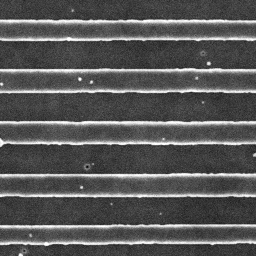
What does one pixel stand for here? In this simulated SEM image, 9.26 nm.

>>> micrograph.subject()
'lines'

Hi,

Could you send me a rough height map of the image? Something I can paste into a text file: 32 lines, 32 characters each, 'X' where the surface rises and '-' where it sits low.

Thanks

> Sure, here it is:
--------------------------------
--------------------------------
--------------------------------
XXXXXXXXXXXXXXXXXXXXXXXXXXXXXXXX
XXXXXXXXXXXXXXXXXXXXXXXXXXXXXXXX
--------------------------------
--------------------------------
--------------------------------
--------------------------------
XXXXXXXXXXXXXXXXXXXXXXXXXXXXXXXX
XXXXXXXXXXXXXXXXXXXXXXXXXXXXXXXX
XXXXXXXXXX-X--XX-XXXX-X-----XXXX
--------------------------------
--------------------------------
--------------------------------
XXXXXXXXXXXXXXXXXXXXXXXXXXXXXXXX
XXXXXXXXXXXXXXXXXXXXXXXXXXXXXXXX
XXXXXXXXXXXXXXXXXXXXXXXXXXXXXXXX
--------------------------------
--------------------------------
--------------------------------
--------------------------------
XXXXXXXXXXXXXXXXXXXXXXXXXXXXXXXX
XXXXXXXXXXXXXXXXXXXXXXXXXXXXXXXX
--XXXXXXXXXXXXXXXXXXXXXXXXXXXXXX
--------------------------------
--------------------------------
--------------------------------
XXXXXXXXXXXXXXXXXXXXXXXXXXXXXXXX
XXXXXXXXXXXXXXXXXXXXXXXXXXXXXXXX
X---XXX---XXXX------------X-----
--------------------------------